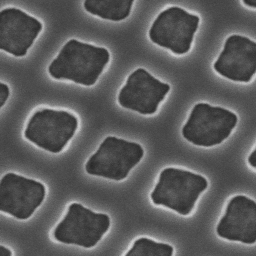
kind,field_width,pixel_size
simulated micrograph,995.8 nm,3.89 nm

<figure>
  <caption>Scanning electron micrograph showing a regular array of holes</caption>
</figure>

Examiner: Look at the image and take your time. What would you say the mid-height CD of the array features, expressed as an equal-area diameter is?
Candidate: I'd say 46.8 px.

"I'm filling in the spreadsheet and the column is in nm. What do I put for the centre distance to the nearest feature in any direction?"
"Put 273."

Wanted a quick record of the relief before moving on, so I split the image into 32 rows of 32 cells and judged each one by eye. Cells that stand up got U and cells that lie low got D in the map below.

UUUUUUUUUUUDDDDDDUUUUUUUUUUUUUUD
DDDUUUUUUUUDDDDDUUUUDDDUUUUUUUUU
DDDDDUUUUUUUUUDUUUUDDDDDDUUUUUUU
DDDDDUUUUUUUUUUUUUUDDDDDDUUUUUUU
DDDDDUUUUUUUUUUUUUUDDDDDUUUUUDUU
DDDDUUUUDDDUUUUUUUUUDDDDUUUUDDDD
UDDUUUUDDDDDDUUUUUUUUDDUUUUUDDDD
UUUUUUUDDDDDDDUUUUUUUUUUUUUDDDDD
UUUUUUDDDDDDDUUUUUUUUUUUUUUDDDDD
UUUUUUDDDDDDUUUUDDDUUUUUUUUUDDDD
DUUUUUUUUUDDUUUUDDDDDUUUUUUUUUUU
DUUUUUUUUUUUUUUDDDDDDUUUUUUUUUUU
DUUUUUUUUUUUUUUDDDDDUUUUUUUUUUUU
UUUUUDUUUUUUUUUUDDDDUUUUDDDDUUUU
UUUUDDDDDUUUUUUUUUUUUUUUDDDDDUUU
UUUDDDDDDDUUUUUUUUUUUUUDDDDDDUUU
UUUDDDDDDUUUUUUUUUUUUUUDDDDDDUUU
UUUDDDDDDUUUUDDDUUUUUUUDDDDDUUUU
UUUUUDDDUUUUDDDDDDUUUUUUUUUUUUUU
UUUUUUUUUUUDDDDDDDUUUUUUUUUUUUUD
UUUUUUUUUUUDDDDDDUUUUUUUUUUUUUUD
UUUUUUUUUUUDDDDDUUUUDDDDUUUUUUUU
DDDDUUUUUUUUUUDUUUUUDDDDDDUUUUUU
DDDDDDUUUUUUUUUUUUUDDDDDDDUUUUUU
DDDDDDUUUUUUUUUUUUUDDDDDDUUUUUDU
DDDDDUUUUDUUUUUUUUUUDDDDUUUUDDDD
UDDDUUUUDDDDUUUUUUUUUUDDUUUUDDDD
UUUUUUUUDDDDDDUUUUUUUUUUUUUDDDDD
UUUUUUUDDDDDDDUUUUUUUUUUUUUDDDDD
UUUUUUUDDDDDDUUUUUUUUUUUUUUDDDDD
UUUUUUUUUDDDUUUUUDDDDUUUUUUUUUUU
DUUUUUUUUUUUUUUUDDDDDDUUUUUUUUUU